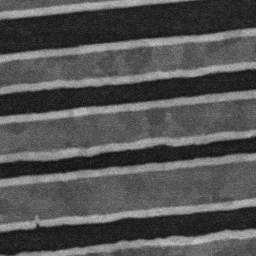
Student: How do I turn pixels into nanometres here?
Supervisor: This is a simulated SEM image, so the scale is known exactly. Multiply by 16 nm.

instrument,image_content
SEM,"one or a few lines or trenches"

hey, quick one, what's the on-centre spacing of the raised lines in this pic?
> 1040 nm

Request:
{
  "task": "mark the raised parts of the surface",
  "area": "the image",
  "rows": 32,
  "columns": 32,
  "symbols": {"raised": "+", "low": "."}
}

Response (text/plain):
++++++++++++++..................
++++............................
................................
................................
............................++++
.................+++++++++++++++
.........+++++++++++++++++++++++
++++++++++++++++++++++++++++++++
+++++++++++++++++++++++++++.....
+++++++++++++++++++.............
+++++++.........................
................................
.........................+++++++
................++++++++++++++++
.......+++++++++++++++++++++++++
++++++++++++++++++++++++++++++++
++++++++++++++++++++++++++++++++
++++++++++++++++++++++++........
+++++++++++++...................
++..............................
........................++++++++
..............++++++++++++++++++
....++++++++++++++++++++++++++++
++++++++++++++++++++++++++++++++
++++++++++++++++++++++++++++++++
++++++++++++++++++++++++++++++..
+++++++++++++++++++.............
+++++++++.......................
................................
............................++++
..................++++++++++++++
..........++++++++++++++++++++++